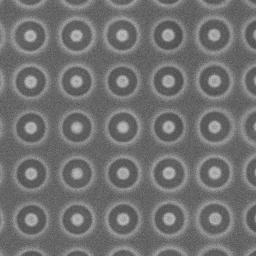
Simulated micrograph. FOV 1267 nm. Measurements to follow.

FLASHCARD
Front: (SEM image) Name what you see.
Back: an array of small figures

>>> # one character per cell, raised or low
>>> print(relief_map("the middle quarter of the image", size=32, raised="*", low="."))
**************.***********.*****
*.....******.....*******.....***
.......****.......*****.......**
...*...****...*...****...**...**
..**...****..***...***...**...**
.......****...*...*****..**...**
......******......*****......***
*....********....*******....****
********************************
********************************
********************************
********************************
**...********....*******....****
......******......*****......***
.......****.......*****.......**
...*...****...**...***...**...**
...*...****...*....****..**...**
.......****.......*****......***
......******......******.....***
**...********...**********.*****
********************************
********************************
********************************
*************************..*****
*.....******......******.....***
......*****.......*****.......**
.......****...**...***...**...**
..**...****...**...***...**...**
.......****...*...****....*...**
......******......*****.......**
*....********....*******.....***
********************************